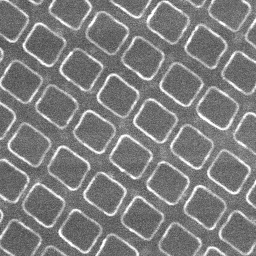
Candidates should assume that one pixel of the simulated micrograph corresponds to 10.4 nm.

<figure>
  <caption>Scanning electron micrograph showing a regular array of raised bodies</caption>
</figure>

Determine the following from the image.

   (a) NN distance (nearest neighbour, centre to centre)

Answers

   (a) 456 nanometres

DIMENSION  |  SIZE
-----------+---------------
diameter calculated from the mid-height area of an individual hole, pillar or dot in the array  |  392 nanometers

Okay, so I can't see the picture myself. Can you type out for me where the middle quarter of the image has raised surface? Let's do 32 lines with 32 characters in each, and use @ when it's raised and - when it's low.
@@@@@@@@@@------@@@@@@@@---@@@--
@@@@@@@@@--------@@@@@@---@@@@@-
@@@@@@@@@---------@@@@@---@@@@@@
-@@@@@@@---@@@------@@---@@@@@@@
--@@@@@@--@@@@@---------@@@@@@@@
----@@@---@@@@@@@-------@@@@@@@@
-----@---@@@@@@@@@-------@@@@@@@
@--------@@@@@@@@@@-------@@@@@@
@@-------@@@@@@@@@@--------@@@@@
@@@------@@@@@@@@@--@@@------@@@
@@@-------@@@@@@@---@@@@--------
@@@---------@@@@@--@@@@@@@------
@@---@@@-----@@@---@@@@@@@@-----
@@--@@@@@---------@@@@@@@@@@----
@---@@@@@@@-------@@@@@@@@@@----
---@@@@@@@@@------@@@@@@@@@---@@
---@@@@@@@@@@------@@@@@@@@--@@@
---@@@@@@@@@@--------@@@@@---@@@
---@@@@@@@@@--@@@-----@@@@--@@@@
----@@@@@@@---@@@@-----@@--@@@@@
------@@@@@--@@@@@@@-------@@@@@
@------@@@--@@@@@@@@@------@@@@@
@@@---------@@@@@@@@@@------@@@@
@@@@--------@@@@@@@@@@-------@@@
@@@@@@------@@@@@@@@@---------@@
@@@@@@-------@@@@@@@@--@@@@-----
@@@@@@--------@@@@@@---@@@@@----
@@@@@---@@------@@@---@@@@@@@@--
@@@@@---@@@------@----@@@@@@@@@-
@@@@---@@@@@@--------@@@@@@@@@@-
-@@@--@@@@@@@@-------@@@@@@@@@@-
------@@@@@@@@@------@@@@@@@@@--